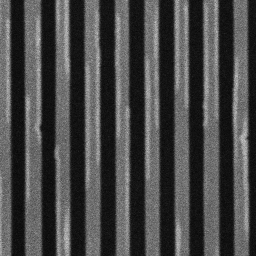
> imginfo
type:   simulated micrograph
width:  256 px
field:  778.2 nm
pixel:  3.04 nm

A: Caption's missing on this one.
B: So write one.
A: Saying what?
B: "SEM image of parallel lines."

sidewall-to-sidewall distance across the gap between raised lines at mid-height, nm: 45.5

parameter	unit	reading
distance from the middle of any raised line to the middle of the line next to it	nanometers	90.2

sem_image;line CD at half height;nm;45.1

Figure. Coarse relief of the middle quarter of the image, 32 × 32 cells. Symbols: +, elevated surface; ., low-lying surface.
+....++++....+++....++++....+++.
+....++++....+++....++++....+++.
+....++++....+++....++++....+++.
+....++++....+++....++++....+++.
+....++++....+++....++++....+++.
+....++++....+++....++++....+++.
+....++++....+++....++++....+++.
+....++++....+++....++++....+++.
+....++++....+++....++++....+++.
+....++++....+++....++++....+++.
+....++++....+++....++++....+++.
+....++++....+++....++++....+++.
+....++++....+++....++++....+++.
+....++++....+++....++++....+++.
+....++++....+++....++++....+++.
+....++++....+++....++++....+++.
+....++++....+++....++++....+++.
+....++++....+++....++++....+++.
+....++++....+++....++++....+++.
+....++++....+++....++++....+++.
+....++++....+++....++++....+++.
+....++++....+++....++++....+++.
+....++++....+++....++++....+++.
+....++++....+++....++++....+++.
+....++++....+++....++++....+++.
+....++++....+++....++++....+++.
+....++++....+++....++++....+++.
+....++++....+++....++++....+++.
+....++++....+++....++++....+++.
+....++++....+++....++++....+++.
+....++++....+++....++++....+++.
+....++++....+++....++++....+++.